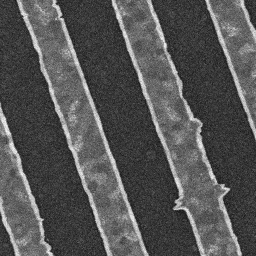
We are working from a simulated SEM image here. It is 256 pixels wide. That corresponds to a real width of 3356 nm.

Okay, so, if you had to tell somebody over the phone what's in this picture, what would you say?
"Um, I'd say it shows one or a few lines or trenches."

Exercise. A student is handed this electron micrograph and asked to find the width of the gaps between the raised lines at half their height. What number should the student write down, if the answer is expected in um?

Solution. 0.714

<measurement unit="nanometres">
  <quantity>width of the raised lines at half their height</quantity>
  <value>446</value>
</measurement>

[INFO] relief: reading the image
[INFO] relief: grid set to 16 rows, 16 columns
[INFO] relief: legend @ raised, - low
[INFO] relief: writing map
-@@@---@@----@@-
--@@----@@---@@@
--@@----@@----@@
---@@---@@@---@@
---@@----@@----@
---@@----@@----@
---@@@---@@@---@
----@@----@@----
@---@@----@@----
@----@@---@@@---
@----@@----@@---
@@---@@@---@@@--
@@----@@---@@@--
@@----@@----@@--
-@@---@@@---@@@-
-@@----@@----@@-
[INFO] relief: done